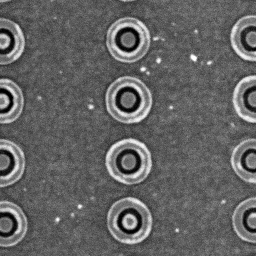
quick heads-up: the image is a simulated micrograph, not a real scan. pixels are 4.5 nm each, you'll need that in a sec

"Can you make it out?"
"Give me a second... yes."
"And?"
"ring-shaped raised bodies with a dot in the middle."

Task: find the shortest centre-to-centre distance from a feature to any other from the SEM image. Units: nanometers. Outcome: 268